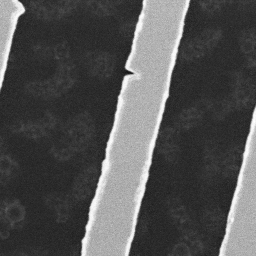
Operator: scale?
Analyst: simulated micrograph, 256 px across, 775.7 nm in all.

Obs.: one or a few lines or trenches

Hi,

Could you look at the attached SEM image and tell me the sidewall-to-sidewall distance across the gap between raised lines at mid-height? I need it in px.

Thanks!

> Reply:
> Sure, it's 92.3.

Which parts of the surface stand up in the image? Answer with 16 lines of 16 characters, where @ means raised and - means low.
@--------@@@----
@--------@@-----
@-------@@@-----
--------@@@-----
--------@@@-----
--------@@@-----
-------@@@------
-------@@@------
-------@@@------
-------@@------@
-------@@------@
------@@@------@
------@@@------@
------@@@-----@@
-----@@@------@@
-----@@@------@@